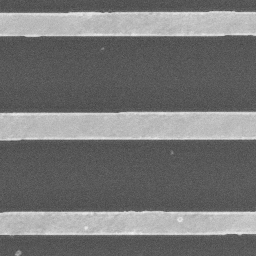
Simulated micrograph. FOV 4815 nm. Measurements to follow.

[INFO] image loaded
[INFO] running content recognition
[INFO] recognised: lines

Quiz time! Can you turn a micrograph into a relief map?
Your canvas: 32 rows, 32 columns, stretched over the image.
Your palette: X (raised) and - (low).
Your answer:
--------------------------------
--------------------------XXX---
XXXXXXXXXXXXXXXXXXXXXXXXXXXXXXXX
XXXXXXXXXXXXXXXXXXXXXXXXXXXXXXXX
--------------------------------
--------------------------------
--------------------------------
--------------------------------
--------------------------------
--------------------------------
--------------------------------
--------------------------------
--------------------------------
--------------------------------
XXXXXXXXXXXXXXXXXXXXXXXXXXXXXXXX
XXXXXXXXXXXXXXXXXXXXXXXXXXXXXXXX
XXXXXXXXXXXXXXXXXXXXXXXXXXXXXXXX
--------------------------------
--------------------------------
--------------------------------
--------------------------------
--------------------------------
--------------------------------
--------------------------------
--------------------------------
--------------------------------
-------------------XX-----------
XXXXXXXXXXXXXXXXXXXXXXXXXXXXXXXX
XXXXXXXXXXXXXXXXXXXXXXXXXXXXXXXX
--------------------------------
--------------------------------
--------------------------------